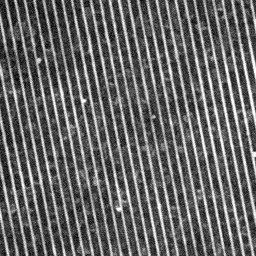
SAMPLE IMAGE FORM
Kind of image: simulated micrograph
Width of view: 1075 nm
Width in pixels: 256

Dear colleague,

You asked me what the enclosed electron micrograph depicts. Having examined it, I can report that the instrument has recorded parallel lines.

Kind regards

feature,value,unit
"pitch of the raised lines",38.8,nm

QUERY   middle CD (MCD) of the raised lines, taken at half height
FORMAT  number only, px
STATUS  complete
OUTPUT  1.83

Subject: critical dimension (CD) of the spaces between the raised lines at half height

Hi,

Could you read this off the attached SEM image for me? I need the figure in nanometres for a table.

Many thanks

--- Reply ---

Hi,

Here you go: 31.4